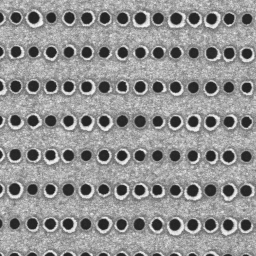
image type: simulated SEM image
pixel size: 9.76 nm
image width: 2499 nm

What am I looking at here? a regular array of holes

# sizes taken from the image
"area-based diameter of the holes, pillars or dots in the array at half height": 108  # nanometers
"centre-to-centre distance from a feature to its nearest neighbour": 172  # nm